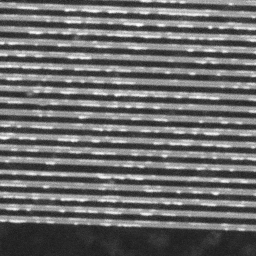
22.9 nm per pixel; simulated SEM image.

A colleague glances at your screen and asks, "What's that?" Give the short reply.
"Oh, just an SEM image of parallel lines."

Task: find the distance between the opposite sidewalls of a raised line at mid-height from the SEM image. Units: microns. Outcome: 0.117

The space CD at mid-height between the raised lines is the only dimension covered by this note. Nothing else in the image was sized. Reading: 160 nm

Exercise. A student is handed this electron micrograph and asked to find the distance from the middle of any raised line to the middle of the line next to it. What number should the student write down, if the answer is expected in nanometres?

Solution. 270